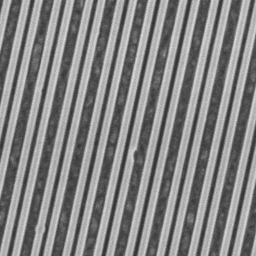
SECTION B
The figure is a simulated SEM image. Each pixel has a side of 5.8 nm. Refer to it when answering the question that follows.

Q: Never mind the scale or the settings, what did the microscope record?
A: parallel lines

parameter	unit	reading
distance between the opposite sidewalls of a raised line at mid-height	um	0.0419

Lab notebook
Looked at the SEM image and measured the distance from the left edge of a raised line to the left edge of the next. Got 0.0888 micrometres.